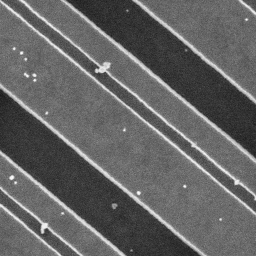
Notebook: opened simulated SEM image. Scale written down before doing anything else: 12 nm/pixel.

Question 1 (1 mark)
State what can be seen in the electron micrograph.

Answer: lines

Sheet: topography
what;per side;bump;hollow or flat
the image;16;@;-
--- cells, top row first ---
@@@@@----@@@@@@@
@@@@@@----@@@@@@
@@@@@@@----@@@@@
@@@@@@@@-----@@@
@@@@@@@@@-----@@
@@@@@@@@@@@----@
-@@@@@@@@@@@----
---@@@@@@@@@@---
----@@@@@@@@@@--
-----@@@@@@@@@@-
@-----@@@@@@@@@@
@@-----@@@@@@@@@
@@@@-----@@@@@@@
@@@@@-----@@@@@@
@@@@@@-----@@@@@
@@@@@@@-----@@@@